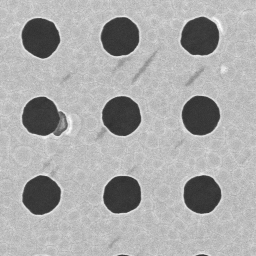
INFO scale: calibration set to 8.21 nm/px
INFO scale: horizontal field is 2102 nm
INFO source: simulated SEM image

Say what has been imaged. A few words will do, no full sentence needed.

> a regular array of holes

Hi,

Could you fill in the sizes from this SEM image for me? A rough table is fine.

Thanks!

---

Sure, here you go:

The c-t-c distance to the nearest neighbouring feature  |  0.646 micrometres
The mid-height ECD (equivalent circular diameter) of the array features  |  318 nm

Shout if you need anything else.